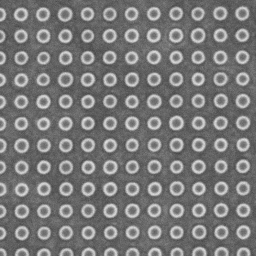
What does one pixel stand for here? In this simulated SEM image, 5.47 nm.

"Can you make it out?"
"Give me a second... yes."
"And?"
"a regular array of raised bodies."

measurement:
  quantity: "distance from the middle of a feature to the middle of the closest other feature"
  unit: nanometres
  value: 118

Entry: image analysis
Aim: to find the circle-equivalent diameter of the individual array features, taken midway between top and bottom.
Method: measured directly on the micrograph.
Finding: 65.6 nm